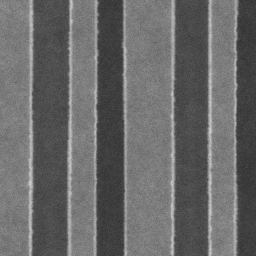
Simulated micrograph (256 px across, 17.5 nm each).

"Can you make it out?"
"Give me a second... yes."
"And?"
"lines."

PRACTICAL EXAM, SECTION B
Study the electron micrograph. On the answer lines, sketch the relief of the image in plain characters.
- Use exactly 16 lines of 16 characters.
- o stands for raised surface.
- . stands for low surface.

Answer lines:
oo..oo..ooo..oo.
oo..oo..ooo..oo.
oo..oo..ooo..oo.
oo..oo..ooo..oo.
oo..oo..ooo..oo.
oo..oo..ooo..oo.
oo..oo..ooo..oo.
oo..oo..ooo..oo.
oo..oo..ooo..oo.
oo..oo..ooo..oo.
oo..oo..ooo..oo.
oo..oo..ooo..oo.
oo..oo..ooo..oo.
oo..oo..ooo..oo.
oo..oo..ooo..oo.
oo..oo..ooo..oo.